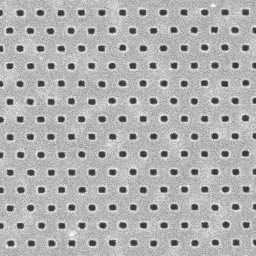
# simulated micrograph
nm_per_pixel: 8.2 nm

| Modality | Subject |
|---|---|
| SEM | a regular array of holes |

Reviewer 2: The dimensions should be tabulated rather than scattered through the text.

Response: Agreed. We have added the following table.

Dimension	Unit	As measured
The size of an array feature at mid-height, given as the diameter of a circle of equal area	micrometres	0.0628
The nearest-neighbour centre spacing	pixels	20.1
